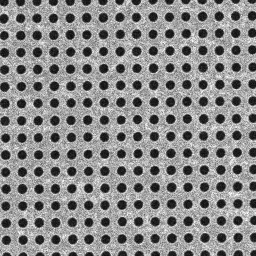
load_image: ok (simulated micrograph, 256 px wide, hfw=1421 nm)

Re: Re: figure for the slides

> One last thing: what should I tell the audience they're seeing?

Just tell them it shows a regular array of holes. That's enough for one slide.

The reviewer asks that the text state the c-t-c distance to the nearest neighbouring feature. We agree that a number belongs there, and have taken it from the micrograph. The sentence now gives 0.0908 µm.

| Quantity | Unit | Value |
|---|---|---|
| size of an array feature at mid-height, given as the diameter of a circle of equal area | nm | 53.1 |